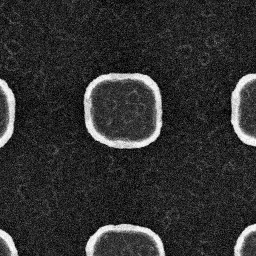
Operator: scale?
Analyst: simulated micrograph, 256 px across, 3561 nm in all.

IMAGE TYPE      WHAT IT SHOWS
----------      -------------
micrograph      raised bodies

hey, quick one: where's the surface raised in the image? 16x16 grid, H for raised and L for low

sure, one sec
LLLLLLLLLLLLLLLL
LLLLLLLLLLLLLLLL
LLLLLLLLLLLLLLLL
LLLLLLLLLLLLLLLL
LLLLLLLLLLLLLLLL
LLLLLLHHHHLLLLLH
HLLLLHHHHHLLLLLH
HLLLLLHHHHLLLLLH
LLLLLLHHHHLLLLLH
LLLLLLLLLLLLLLLL
LLLLLLLLLLLLLLLL
LLLLLLLLLLLLLLLL
LLLLLLLLLLLLLLLL
LLLLLLLLLLLLLLLL
LLLLLLHHHLLLLLLH
HLLLLLHHHHLLLLLH